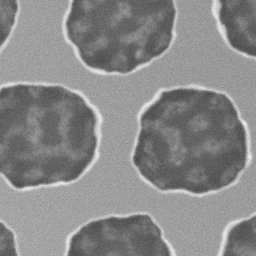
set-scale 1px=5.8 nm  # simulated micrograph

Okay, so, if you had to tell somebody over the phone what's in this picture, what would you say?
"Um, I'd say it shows holes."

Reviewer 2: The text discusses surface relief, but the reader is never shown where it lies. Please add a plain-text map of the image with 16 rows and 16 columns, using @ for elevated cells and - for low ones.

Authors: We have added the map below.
-@@@-------@@@--
-@@@-------@@@--
@@@@-------@@@--
@@@@@-----@@@@@@
@@@@@@@-@@@@@@@@
----@@@@@@@@@@@@
-----@@@@@-----@
------@@@------@
------@@@------@
------@@-------@
-----@@@@------@
@--@@@@@@@----@@
@@@@@@@@@@@@@@@@
@@@@@@@@-@@@@@@@
-@@@@-----@@@@--
-@@@-------@@@--